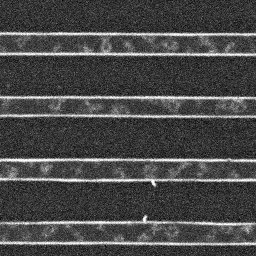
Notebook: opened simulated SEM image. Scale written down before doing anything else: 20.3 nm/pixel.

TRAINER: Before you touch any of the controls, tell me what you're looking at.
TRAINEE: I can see one or a few lines or trenches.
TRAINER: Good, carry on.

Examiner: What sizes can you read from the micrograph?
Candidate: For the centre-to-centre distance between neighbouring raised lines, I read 1280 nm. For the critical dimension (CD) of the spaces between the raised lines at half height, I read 43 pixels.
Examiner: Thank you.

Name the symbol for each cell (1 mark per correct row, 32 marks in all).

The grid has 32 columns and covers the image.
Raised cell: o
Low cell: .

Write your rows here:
................................
................................
................................
................................
oooooooooooooooooooooooooooooooo
oooooooooooooooooooooooooooooooo
oooooooooooooooooooooooooooooooo
................................
................................
................................
................................
................................
oooooooooooooooooooooooooooooooo
oooooooooooooooooooooooooooooooo
...........ooooooooooooooooooooo
................................
................................
................................
................................
................................
oooooooooooooooooooooooooooooooo
oooooooooooooooooooooooooooooooo
........ooooooo...oo..........oo
................................
................................
................................
................................
................................
oooooooooooooooooooooooooooooooo
oooooooooooooooooooooooooooooooo
......................oo........
................................